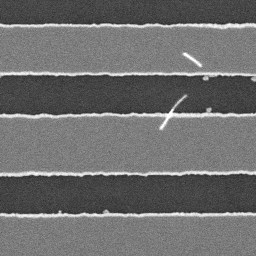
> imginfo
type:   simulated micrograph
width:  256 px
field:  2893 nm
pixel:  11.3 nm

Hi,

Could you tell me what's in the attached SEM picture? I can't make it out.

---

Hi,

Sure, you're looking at lines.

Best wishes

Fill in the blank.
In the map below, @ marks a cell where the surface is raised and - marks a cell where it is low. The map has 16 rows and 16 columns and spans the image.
----------------
----------------
@@@@@@@@@@@@@@@@
@@@@@@@@@@@@@@@@
@@@@@@@@@@@@@@@@
----------------
----------------
@@@@@@@@@@@@@@@@
@@@@@@@@@@@@@@@@
@@@@@@@@@@@@@@@@
@@@@@@@@@@@@@@@@
----------------
----------------
@@@@@@@@@@@@@@@@
@@@@@@@@@@@@@@@@
@@@@@@@@@@@@@@@@